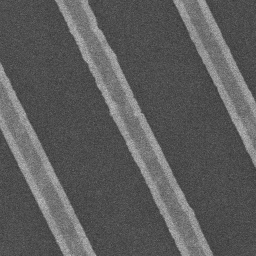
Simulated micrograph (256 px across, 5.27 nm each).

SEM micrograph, one or a few lines or trenches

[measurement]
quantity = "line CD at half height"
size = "121 nm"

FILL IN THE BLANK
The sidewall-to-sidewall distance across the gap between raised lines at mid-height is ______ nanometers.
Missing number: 437